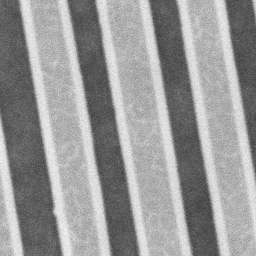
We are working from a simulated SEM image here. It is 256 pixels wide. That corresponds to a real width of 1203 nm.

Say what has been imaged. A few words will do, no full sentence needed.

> one or a few lines or trenches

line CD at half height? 189 nanometers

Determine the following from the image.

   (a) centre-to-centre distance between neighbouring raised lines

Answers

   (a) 363 nanometers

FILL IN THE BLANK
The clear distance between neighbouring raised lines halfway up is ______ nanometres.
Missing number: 167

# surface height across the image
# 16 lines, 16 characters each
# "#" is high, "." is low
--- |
..##..###..###..
..##..###...##..
..##...##...##..
..###..###..##..
..###..###..###.
..###..###..###.
...##..###..###.
...##..###...##.
...###..###..##.
...###..###..##.
...###..###..###
...###..###..###
#...##..###..###
#...##...##...##
#...##...##...##
#...###..###..##